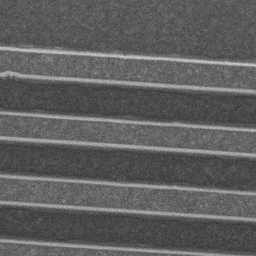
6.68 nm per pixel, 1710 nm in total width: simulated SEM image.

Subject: one or a few lines or trenches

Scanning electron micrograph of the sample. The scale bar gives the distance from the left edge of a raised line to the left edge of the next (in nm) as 426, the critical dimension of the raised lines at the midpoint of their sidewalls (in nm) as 175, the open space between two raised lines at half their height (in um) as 0.252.